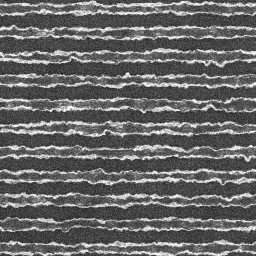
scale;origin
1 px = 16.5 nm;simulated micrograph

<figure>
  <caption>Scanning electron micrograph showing parallel lines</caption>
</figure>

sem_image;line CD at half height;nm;155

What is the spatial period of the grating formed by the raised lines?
396 nm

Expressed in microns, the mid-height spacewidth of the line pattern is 0.244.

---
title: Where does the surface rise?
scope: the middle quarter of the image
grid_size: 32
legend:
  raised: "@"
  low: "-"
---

--------------------------------
--------------------------------
--------------------------------
@@@@@@@@@@@@@@@@@@@@@@@@@@@@@@@@
@@@@@@@@@@@@@@@@@@@@@@@@@@@@@@@@
-----------@@@------------------
--------------------------------
--------------------------------
--------------------------------
@@@@@@@@@@@@@@@@@@@@@@@@@@@@@@@@
@@@@@@@@@@@@@@@@@@@@@@@@@@@@@@@@
-------------------@@@------@@@-
--------------------------------
--------------------------------
--------------------------------
@@@@@@@@@@@@@@@@@@@@@@@@@@@@@@@@
@@@@@@@@@@@@@@@@@@@@@@@@@@@@@@@@
-----@@@@@-----------@------@@@@
--------------------------------
--------------------------------
--------------------------------
@@@@@@@@@@@@@@@@@@@@@@@@@@@@@@--
@@@@@@@@@@@@@@@@@@@@@@@@@@@@@@@@
----------@@@@@-@-@@----------@-
--------------------------------
--------------------------------
--------@@----------------------
@@@@@@@@@@@@@@@@@@@@@@@@@@@@@@@@
@@@@@@@@@@@@@@@@@@@@@@@@@@@@@@@@
------@@@-@@@@------------------
--------------------------------
--------------------------------